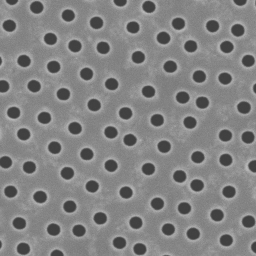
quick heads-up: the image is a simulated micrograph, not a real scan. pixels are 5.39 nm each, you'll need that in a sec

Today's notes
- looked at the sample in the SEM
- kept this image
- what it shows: a regular array of holes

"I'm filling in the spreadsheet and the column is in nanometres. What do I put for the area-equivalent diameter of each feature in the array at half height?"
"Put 68.5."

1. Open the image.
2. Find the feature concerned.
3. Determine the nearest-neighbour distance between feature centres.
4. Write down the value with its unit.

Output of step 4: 139 nanometres